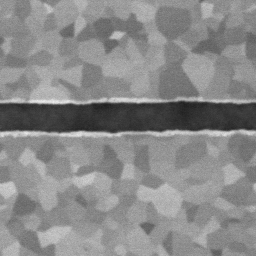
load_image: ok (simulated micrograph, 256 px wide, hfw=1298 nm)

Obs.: one or a few lines or trenches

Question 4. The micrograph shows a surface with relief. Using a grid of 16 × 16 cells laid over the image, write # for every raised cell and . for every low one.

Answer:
################
################
################
################
################
################
................
................
################
################
################
################
################
################
################
################